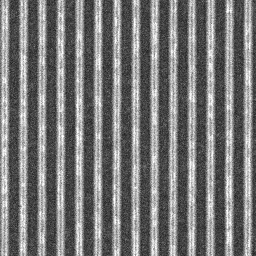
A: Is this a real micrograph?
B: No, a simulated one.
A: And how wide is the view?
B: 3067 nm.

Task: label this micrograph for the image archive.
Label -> parallel lines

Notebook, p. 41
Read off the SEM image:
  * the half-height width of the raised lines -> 73.4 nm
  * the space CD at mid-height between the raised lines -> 145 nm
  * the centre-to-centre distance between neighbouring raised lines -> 224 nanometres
